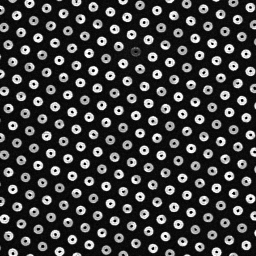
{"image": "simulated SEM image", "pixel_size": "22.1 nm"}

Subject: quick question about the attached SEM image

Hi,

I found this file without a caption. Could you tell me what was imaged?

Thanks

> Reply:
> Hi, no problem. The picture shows a regular array of ring-shaped raised bodies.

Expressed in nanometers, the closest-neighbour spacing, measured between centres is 385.